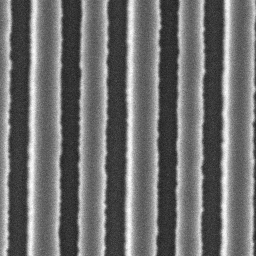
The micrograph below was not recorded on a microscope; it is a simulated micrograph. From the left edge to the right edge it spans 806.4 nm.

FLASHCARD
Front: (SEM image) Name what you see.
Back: lines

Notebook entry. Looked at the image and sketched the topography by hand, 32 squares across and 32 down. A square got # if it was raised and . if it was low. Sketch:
#...####..###...####..###...####
#...####..###...####..###...####
#...####..###...####..###...####
#...####..###...####..###...####
#...####..###...####..###...####
#...####..###...####..###...####
#...####..###...####..###...####
#...###...###...####..###...####
#...####..###...####..###...####
#...###...###...####..###...####
#...###...###...####..###...####
#...###...###...####..###...####
#...###...###...####..###...####
#...###...###...####..###...####
#...###...###...####..###...####
#...###...###...####..###...####
#...####..###...####..###...####
#...####..###...####..###...####
#...###...###...####..###...####
#...####..###...####..###...####
#...###...###...####..###...####
#...###...###...####..###...####
#...###...###...####..###...####
#...###...###...####..###...####
#...###...###...####..###...####
#...###...###...####..###...####
#...###...###...####..###...####
#...###...###...###...###...####
#...###...###...####..###...####
#...###...###...####..###...###.
#...###...###...###...###...####
#...###...###...###...###...####